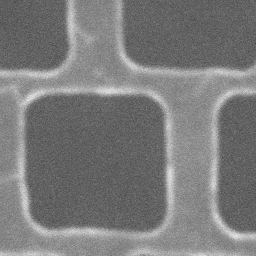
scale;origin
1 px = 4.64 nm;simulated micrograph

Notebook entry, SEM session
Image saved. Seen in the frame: holes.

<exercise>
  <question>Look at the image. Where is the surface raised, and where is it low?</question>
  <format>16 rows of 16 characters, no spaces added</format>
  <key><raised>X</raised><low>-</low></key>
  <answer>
----XXXX--------
----XXXX--------
----XXXX--------
----XXXX--------
XX-XXXXXXXXXXXXX
XXXXXXXXXXXXXXXX
XX--------XXXX--
X---------XXXX--
X---------XXXX--
X---------XXXX--
X---------XXX---
XX--------XXX---
XX---------XXX--
XX--------XXXX--
XXXXXXXX-XXXXXX-
XXXXXXXXXXXXXXXX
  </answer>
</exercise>